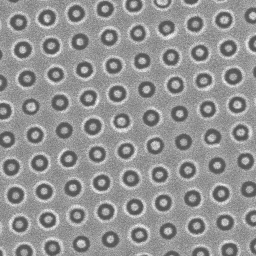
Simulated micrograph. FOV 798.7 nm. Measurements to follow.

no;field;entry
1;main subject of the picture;a regular array of ring-shaped grooves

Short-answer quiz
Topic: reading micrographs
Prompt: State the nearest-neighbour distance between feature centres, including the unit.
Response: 28.3 px